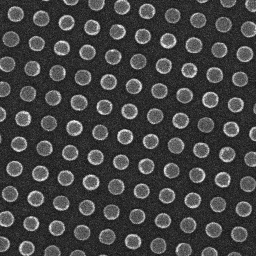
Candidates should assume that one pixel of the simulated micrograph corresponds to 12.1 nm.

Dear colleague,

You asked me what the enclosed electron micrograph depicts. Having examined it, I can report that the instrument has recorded a regular array of raised bodies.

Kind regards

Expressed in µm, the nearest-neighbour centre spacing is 0.306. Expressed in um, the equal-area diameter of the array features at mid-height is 0.187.